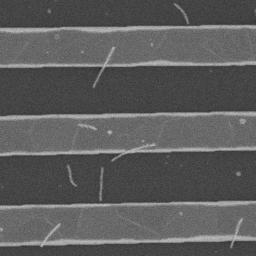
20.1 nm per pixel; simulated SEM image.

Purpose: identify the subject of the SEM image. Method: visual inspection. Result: lines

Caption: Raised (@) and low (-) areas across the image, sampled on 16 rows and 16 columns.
----------------
----------------
@@@@@@@@@@@@@@@@
@@@@@@@@@@@@@@@@
----------------
----------------
----------------
@@@@@@@@@@@@@@@@
@@@@@@@@@@@@@@@@
@@@@@@@@--------
----------------
----------------
----------------
@@@@@@@@@@@@@@@@
@@@@@@@@@@@@@@@@
----------------